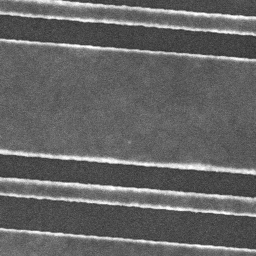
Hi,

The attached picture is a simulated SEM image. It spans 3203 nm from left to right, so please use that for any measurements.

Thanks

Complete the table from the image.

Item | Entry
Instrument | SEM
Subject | lines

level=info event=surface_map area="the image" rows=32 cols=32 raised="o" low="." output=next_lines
oooooooooooo....................
ooooooooooooooooooooooo.........
.........ooooooooooooooooooooooo
.....................ooooooooooo
................................
ooooooo.........................
oooooooooooooooooooo............
oooooooooooooooooooooooooooooooo
oooooooooooooooooooooooooooooooo
oooooooooooooooooooooooooooooooo
oooooooooooooooooooooooooooooooo
oooooooooooooooooooooooooooooooo
oooooooooooooooooooooooooooooooo
oooooooooooooooooooooooooooooooo
oooooooooooooooooooooooooooooooo
oooooooooooooooooooooooooooooooo
oooooooooooooooooooooooooooooooo
oooooooooooooooooooooooooooooooo
oooooooooooooooooooooooooooooooo
....oooooooooooooooooooooooooooo
.................ooooooooooooooo
..............................oo
ooo.............................
oooooooooooooooo................
..ooooooooooooooooooooooooooo...
.............ooooooooooooooooooo
.........................ooooooo
................................
................................
ooooooooooo.....................
oooooooooooooooooooooo..........
oooooooooooooooooooooooooooooooo